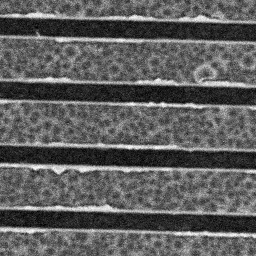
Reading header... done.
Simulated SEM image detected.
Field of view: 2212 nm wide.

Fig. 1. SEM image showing parallel lines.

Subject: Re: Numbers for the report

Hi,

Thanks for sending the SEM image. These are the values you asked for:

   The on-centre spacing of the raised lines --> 63.9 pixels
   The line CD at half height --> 0.384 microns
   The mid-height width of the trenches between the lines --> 171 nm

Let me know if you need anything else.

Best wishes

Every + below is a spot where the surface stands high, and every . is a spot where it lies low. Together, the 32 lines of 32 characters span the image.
++++++++++++++++++++++++++++++++
++++++++++++++++++++++++++++++++
..................++++++++++++++
................................
................................
++++++++++++++++++++++++++++++++
++++++++++++++++++++++++++++++++
++++++++++++++++++++++++++++++++
++++++++++++++++++++++++++++++++
++++++++++++++++++++++++++++++++
..................+..+++++++++++
................................
................................
++++++++++++++++++++++++++++++++
++++++++++++++++++++++++++++++++
++++++++++++++++++++++++++++++++
++++++++++++++++++++++++++++++++
++++++++++++++++++++++++++++++++
................++++++++++++++++
................................
................................
++++++++++++++++++++++++++++++++
++++++++++++++++++++++++++++++++
++++++++++++++++++++++++++++++++
++++++++++++++++++++++++++++++++
++++++++++++++++++++++++++++++++
...................+.+++++++++++
................................
................................
++++++++++++++++++++++++++++++++
++++++++++++++++++++++++++++++++
++++++++++++++++++++++++++++++++